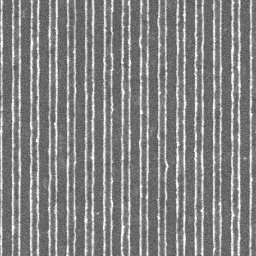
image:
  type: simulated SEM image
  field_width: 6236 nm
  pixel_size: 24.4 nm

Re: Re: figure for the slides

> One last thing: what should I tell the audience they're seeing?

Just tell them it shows parallel lines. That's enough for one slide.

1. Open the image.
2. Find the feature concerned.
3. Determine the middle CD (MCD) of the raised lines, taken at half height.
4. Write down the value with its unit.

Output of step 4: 7.63 px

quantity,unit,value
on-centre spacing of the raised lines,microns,0.446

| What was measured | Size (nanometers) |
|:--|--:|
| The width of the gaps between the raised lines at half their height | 253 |